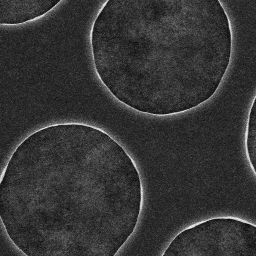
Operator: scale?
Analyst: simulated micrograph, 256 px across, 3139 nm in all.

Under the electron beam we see holes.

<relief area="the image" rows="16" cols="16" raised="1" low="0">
0001110000000011
0111110000000011
1111110000000011
1111110000000011
1111110000000011
1111111000000011
1111111100001111
1111111111111111
1100000111111110
1000000011111110
0000000011111111
0000000001111111
0000000001111111
0000000001111111
0000000011100000
1000000111000000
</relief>